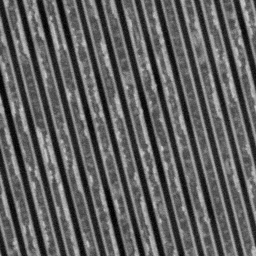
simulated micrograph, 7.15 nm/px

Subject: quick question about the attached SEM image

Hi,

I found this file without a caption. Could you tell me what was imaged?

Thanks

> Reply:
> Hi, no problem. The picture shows parallel lines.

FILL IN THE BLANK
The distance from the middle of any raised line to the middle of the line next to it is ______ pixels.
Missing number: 19.1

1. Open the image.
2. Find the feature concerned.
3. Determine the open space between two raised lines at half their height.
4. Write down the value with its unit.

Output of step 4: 55.5 nm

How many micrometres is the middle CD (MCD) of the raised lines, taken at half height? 0.0806